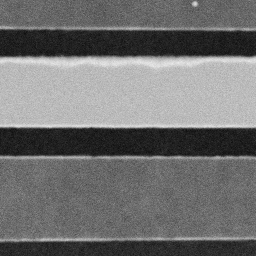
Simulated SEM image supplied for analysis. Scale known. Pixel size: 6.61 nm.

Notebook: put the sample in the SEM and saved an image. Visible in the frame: lines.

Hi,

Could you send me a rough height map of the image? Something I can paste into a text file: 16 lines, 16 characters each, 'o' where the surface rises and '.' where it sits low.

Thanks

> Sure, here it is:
oooooooooooooooo
oooooooooooooooo
................
................
oooooooooooooooo
oooooooooooooooo
oooooooooooooooo
oooooooooooooooo
................
................
oooooooooooooooo
oooooooooooooooo
oooooooooooooooo
oooooooooooooooo
oooooooooooooooo
................